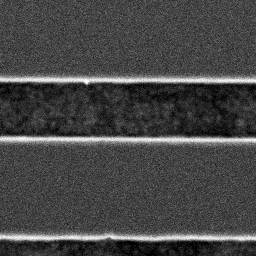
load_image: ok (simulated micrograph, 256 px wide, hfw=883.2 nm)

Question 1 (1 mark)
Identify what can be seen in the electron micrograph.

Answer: one or a few lines or trenches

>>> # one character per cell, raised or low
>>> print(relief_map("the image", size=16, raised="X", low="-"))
XXXXXXXXXXXXXXXX
XXXXXXXXXXXXXXXX
XXXXXXXXXXXXXXXX
XXXXXXXXXXXXXXXX
XXXXXXXXXXXXXXXX
----------------
----------------
----------------
----------------
XXXXXXXXXXXXXXXX
XXXXXXXXXXXXXXXX
XXXXXXXXXXXXXXXX
XXXXXXXXXXXXXXXX
XXXXXXXXXXXXXXXX
XXXXXXXXXXXXXXXX
----------------